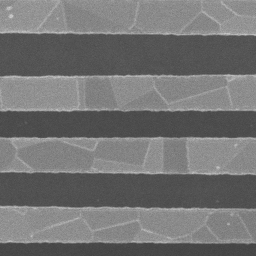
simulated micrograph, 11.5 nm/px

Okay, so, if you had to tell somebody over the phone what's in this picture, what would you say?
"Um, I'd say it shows lines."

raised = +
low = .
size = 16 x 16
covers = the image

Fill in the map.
++++++++++++++++
++++++++++++++++
................
................
................
++++++++++++++++
++++++++++++++++
................
................
++++++++++++++++
++++++++++++++++
................
................
++++++++++++++++
++++++++++++++++
................